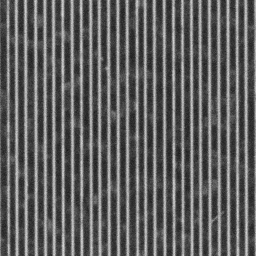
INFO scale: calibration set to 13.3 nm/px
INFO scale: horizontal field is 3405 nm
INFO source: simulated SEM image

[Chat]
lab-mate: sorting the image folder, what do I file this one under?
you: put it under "parallel lines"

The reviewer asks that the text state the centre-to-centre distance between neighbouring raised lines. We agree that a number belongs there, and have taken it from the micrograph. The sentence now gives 122 nm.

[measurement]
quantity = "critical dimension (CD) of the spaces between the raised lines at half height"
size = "94.8 nanometers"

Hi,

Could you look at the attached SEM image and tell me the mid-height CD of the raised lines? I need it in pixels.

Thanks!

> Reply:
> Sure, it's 2.13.